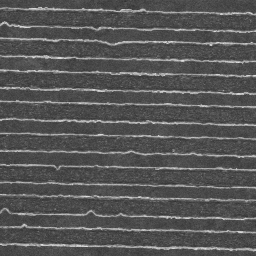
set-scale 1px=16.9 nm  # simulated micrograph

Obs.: parallel lines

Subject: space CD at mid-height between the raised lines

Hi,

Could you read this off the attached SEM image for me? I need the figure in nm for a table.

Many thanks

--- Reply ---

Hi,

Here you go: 294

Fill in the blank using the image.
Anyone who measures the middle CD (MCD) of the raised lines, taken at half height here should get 0.233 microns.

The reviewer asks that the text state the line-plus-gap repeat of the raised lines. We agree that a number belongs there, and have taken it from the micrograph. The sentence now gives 530 nanometers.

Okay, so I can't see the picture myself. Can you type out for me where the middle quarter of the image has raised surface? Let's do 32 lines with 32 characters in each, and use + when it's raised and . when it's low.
++++++++++++++++++++++++++++++++
++++++++++++++++++++++++++++++++
............++..+.++++++++++..++
................................
................................
................................
++++++++..+.....................
++++++++++++++++++++++++++++++++
++++++++++++++++++++++++++++++++
++++++++++++++++++++++++++++++++
................................
................................
................................
................................
++++++++++++.+++....++.+........
++++++++++++++++++++++++++++++++
++++++++++++++++++++++++++++++++
+.++++++++++++++++++++++++++++++
..............................+.
................................
................................
................................
+++++++++++++++++++...+++......+
++++++++++++++++++++++++++++++++
++++++++++++++++++++++++++++++++
+.+++.++++++++++++++++++++++++++
................................
................................
................................
................................
++++++++++++++++++++++.++...+...
++++++++++++++++++++++++++++++++